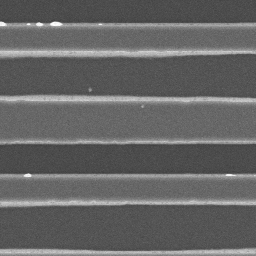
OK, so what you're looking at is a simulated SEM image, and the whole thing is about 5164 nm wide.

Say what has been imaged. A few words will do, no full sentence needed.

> lines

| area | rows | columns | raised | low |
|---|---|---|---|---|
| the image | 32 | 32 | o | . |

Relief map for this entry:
................................
................................
................................
oooooooooooooooooooooooooooooooo
oooooooooooooooooooooooooooooooo
oooooooooooooooooooooooooooooooo
oo..o....oooooooooooo...........
................................
................................
................................
................................
................................
................................
oooooooooooooooooooooooooooooooo
oooooooooooooooooooooooooooooooo
oooooooooooooooooooooooooooooooo
oooooooooooooooooooooooooooooooo
oooooooooooooooooooooooooooooooo
................................
................................
................................
................................
oooooooooooooooooooooooooooooooo
oooooooooooooooooooooooooooooooo
oooooooooooooooooooooooooooooooo
................................
................................
................................
................................
................................
................................
................................